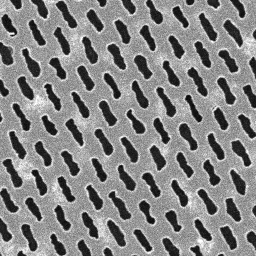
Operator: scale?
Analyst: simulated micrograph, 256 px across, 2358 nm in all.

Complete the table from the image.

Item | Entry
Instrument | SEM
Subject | a regular array of holes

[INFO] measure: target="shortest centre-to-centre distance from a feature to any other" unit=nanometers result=249